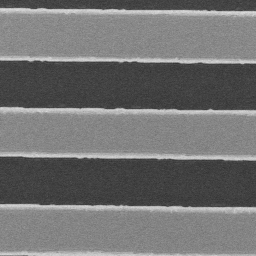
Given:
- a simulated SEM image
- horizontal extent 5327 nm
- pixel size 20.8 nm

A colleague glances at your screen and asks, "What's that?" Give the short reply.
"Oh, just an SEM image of lines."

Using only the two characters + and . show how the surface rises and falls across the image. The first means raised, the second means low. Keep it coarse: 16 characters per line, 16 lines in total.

................
++++++++++++++++
++++++++++++++++
++++++++++++++++
................
................
................
++++++++++++++++
++++++++++++++++
++++++++++++++++
................
................
................
++++++++++++++++
++++++++++++++++
++++++++++++++++